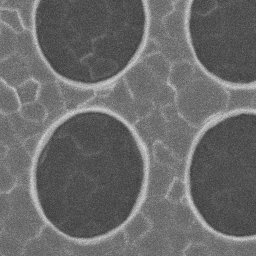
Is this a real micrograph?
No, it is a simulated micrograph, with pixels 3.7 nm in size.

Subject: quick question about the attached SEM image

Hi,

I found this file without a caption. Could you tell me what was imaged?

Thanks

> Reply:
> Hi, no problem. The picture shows holes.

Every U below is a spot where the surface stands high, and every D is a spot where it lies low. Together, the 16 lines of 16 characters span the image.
UUDDDDDDDUUUDDDD
UUDDDDDDDUUUDDDD
UUDDDDDDDUUUDDDD
UUUDDDDDUUUUDDDD
UUUDDDDDUUUUUDDD
UUUUUUUUUUUUUUUU
UUUUUUUUUUUUUUUU
UUUUDDDUUUUUUUDD
UUUDDDDDUUUUDDDD
UUDDDDDDDUUUDDDD
UUDDDDDDDUUUDDDD
UUDDDDDDDUUUDDDD
UUDDDDDDDUUUDDDD
UUUDDDDDUUUUUDDD
UUUUDDDUUUUUUUDD
UUUUUUUUUUUUUUUU